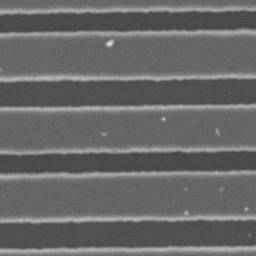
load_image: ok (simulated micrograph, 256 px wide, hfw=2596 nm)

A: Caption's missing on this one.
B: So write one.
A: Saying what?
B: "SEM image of lines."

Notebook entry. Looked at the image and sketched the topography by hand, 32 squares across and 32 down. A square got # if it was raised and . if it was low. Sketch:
################################
#######..#......................
................................
................................
################################
################################
################################
################################
################################
################################
................................
................................
................................
...#....#.######################
################################
################################
################################
################################
################################
................................
................................
.....................###########
################################
################################
################################
################################
################################
##################.####.........
................................
................................
................................
################################